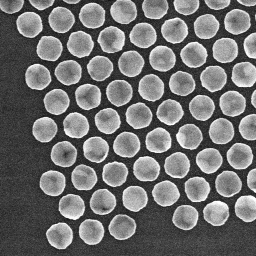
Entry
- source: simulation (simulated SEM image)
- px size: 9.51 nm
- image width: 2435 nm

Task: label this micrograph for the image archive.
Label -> a regular array of raised bodies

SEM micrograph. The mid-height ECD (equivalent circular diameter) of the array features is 0.24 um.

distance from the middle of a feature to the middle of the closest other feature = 290 nm